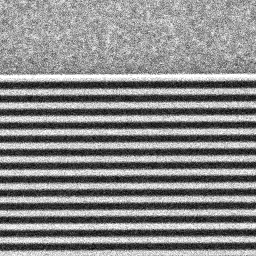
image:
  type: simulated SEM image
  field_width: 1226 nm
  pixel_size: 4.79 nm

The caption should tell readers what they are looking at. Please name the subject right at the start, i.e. parallel lines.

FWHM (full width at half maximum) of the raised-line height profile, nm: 26.4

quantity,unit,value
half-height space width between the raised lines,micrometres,0.0389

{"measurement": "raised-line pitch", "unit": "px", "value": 13.5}